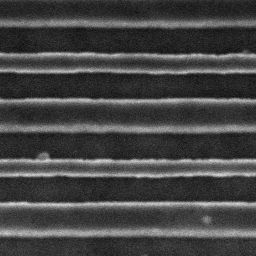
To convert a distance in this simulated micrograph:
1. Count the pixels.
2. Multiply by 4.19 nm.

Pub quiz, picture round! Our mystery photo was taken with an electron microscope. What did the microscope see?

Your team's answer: lines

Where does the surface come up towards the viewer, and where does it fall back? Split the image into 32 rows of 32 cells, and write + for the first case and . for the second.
++++++++++++++++++++++++++++++++
++++++++++++++++++++++++++++++++
++++++++++++++++++++++++++++++++
................................
................................
................................
................................
++++++++++++++++++++++++++++++++
++++++++++++++++++++++++++++++++
................................
................................
................................
...++++++++..........++++++.++..
++++++++++++++++++++++++++++++++
++++++++++++++++++++++++++++++++
++++++++++++++++++++++++++++++++
................................
................................
................................
................................
++++++++++++++++++++++++++++++++
++++++++++++++++++++++++++++++++
................................
................................
................................
++++++++++++++++++++++++++++++++
++++++++++++++++++++++++++++++++
++++++++++++++++++++++++++++++++
++++++++++++++++++++++++++++++++
................................
................................
................................